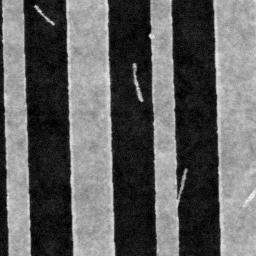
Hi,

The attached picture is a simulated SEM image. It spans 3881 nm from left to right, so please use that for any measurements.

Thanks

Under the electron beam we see lines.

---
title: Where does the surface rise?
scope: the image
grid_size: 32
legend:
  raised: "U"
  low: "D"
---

UUUDDDDDUUUUUDDDDDDUUDDDDDDUUUUU
UUUDDDDDUUUUUDDDDDDUUDDDDDDUUUUU
UUUDDDDDUUUUUDDDDDDUUDDDDDDUUUUU
UUUDDDDDUUUUUDDDDDDUUDDDDDDUUUUU
UUUDDDDDUUUUUDDDDDDUUDDDDDDUUUUU
UUUDDDDDUUUUUDDDDDDUUDDDDDDUUUUU
UUUDDDDDDUUUUDDDDDDUUDDDDDDUUUUU
UUUDDDDDDUUUUDDDDDDUUUDDDDDUUUUU
DUUDDDDDDUUUUUDDDDDUUUDDDDDUUUUU
DUUDDDDDDUUUUUDDDDDUUUDDDDDUUUUU
DUUDDDDDDUUUUUDDDDDUUUDDDDDUUUUU
DUUDDDDDDUUUUUDDDDDUUUDDDDDUUUUU
DUUDDDDDDUUUUUDDDDDUUUDDDDDUUUUU
DUUDDDDDDUUUUUDDDDDUUUDDDDDUUUUU
DUUDDDDDDUUUUUDDDDDUUUDDDDDUUUUU
DUUDDDDDDUUUUUDDDDDUUUDDDDDUUUUU
DUUDDDDDDUUUUUDDDDDUUUDDDDDUUUUU
DUUDDDDDDUUUUUDDDDDUUUDDDDDUUUUU
DUUDDDDDDUUUUUDDDDDUUUDDDDDUUUUU
DUUDDDDDDUUUUUDDDDDUUUDDDDDUUUUU
DUUDDDDDDUUUUUDDDDDUUUDDDDDUUUUU
DUUDDDDDDUUUUUDDDDDUUUDDDDDUUUUU
DUUDDDDDDUUUUUDDDDDUUUDDDDDUUUUU
DUUDDDDDDUUUUUDDDDDUUUDDDDDUUUUU
DUUUDDDDDUUUUUDDDDDDUUDDDDDUUUUU
DUUUDDDDDUUUUUDDDDDUUUDDDDDDUUUU
DUUUDDDDDUUUUUDDDDDDUUDDDDDDUUUU
DUUUDDDDDUUUUUDDDDDDUUDDDDDDUUUU
DUUUDDDDDUUUUUDDDDDDUUDDDDDDUUUU
DUUUDDDDDUUUUUDDDDDDUUDDDDDDUUUU
DUUUDDDDDUUUUUDDDDDDUUDDDDDDUUUU
DUUUDDDDDUUUUUDDDDDDUUDDDDDDUUUU